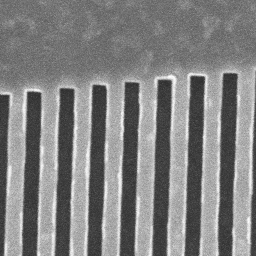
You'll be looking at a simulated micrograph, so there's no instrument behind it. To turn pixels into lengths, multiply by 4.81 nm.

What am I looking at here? parallel lines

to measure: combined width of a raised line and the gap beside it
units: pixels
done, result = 32.5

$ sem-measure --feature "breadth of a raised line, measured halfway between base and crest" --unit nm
84.7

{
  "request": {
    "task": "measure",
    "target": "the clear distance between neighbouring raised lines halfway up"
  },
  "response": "72.1 nm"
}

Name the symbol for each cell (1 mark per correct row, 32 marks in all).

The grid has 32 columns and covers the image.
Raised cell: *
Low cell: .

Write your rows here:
********************************
********************************
********************************
********************************
********************************
********************************
********************************
********************************
********************************
************************.***..**
****************.***..**..**..**
****.**..**..***.***.***..**..**
.**..**..**..***.***.***..**..**
.**..**..**..**..***..**..**..**
.**..**..**..**..**...**..**..**
.**..**..**..**..**..**...**..**
.**..**..**..**..**..***..**..**
.**..**..**..**..**..***.**..***
.**..**..**..**..**..**..**...**
.**..**..**..**..**..**..**...*.
.**..**..**..**..**..**..**..**.
.**..**..**..**..**..**..**..***
.**..**..**..**..**..**..**..***
.**..**..**..**..**..**..**..**.
.**..**..**..**..**..**..**..**.
.**..**..**..**..**..**..**..**.
.**..**..**..**..**..**..**..**.
.**..**..**..**..**..**..**..**.
.**..**..**..**..**..**..**..**.
.**..**..**..**..**..**..**..**.
.**..**..**..**..**..**..**..**.
.**..**..**..**..**..**..**..**.